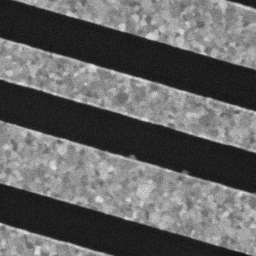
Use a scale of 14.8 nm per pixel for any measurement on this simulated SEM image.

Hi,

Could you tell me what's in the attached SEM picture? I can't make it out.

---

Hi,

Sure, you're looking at lines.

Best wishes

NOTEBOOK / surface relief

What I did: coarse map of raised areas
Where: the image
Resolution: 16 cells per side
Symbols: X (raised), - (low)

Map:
---XXXXXXXXXXXXX
------XXXXXXXXXX
----------XXXXXX
XXXX---------XXX
XXXXXXX---------
--XXXXXXXXX-----
-----XXXXXXXXX--
---------XXXXXXX
XXX---------XXXX
XXXXXXX---------
XXXXXXXXXX------
XXXXXXXXXXXXXX--
----XXXXXXXXXXXX
-------XXXXXXXXX
XX---------XXXXX
XXXXX---------XX